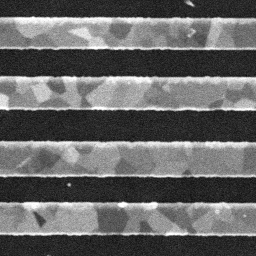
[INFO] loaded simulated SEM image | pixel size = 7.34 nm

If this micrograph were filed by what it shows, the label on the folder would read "lines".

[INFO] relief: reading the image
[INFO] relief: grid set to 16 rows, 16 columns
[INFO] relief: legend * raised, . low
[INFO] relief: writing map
................
****************
****************
................
................
****************
****************
................
................
****************
****************
................
................
****************
****************
................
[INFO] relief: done